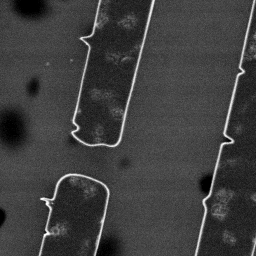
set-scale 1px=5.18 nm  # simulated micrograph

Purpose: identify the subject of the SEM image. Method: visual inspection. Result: one or a few lines or trenches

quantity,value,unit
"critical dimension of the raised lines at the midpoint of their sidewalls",271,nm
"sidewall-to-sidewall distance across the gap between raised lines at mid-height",510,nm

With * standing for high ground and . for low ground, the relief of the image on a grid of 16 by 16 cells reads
......****......
......***.......
.....****......*
.....****......*
.....****......*
.....***.......*
.....***......**
.....***......**
.....***......**
..............**
.............***
....**.......***
...****......***
...****......***
...***.......***
...***......****